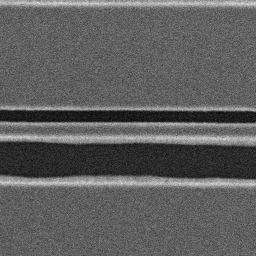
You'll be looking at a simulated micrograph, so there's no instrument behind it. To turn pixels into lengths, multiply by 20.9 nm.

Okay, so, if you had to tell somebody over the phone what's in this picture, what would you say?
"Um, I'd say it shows lines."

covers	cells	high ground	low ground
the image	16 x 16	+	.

++++++++++++++++
++++++++++++++++
++++++++++++++++
++++++++++++++++
++++++++++++++++
++++++++++++++++
++++++++++++++++
++++++++++++++++
++++++++++++++++
................
................
++++++++++++++++
++++++++++++++++
++++++++++++++++
++++++++++++++++
++++++++++++++++